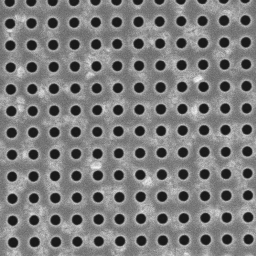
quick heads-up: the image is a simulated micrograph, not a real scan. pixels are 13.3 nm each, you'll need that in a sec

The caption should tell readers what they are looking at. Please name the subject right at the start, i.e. a regular array of holes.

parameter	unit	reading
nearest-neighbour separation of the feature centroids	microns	0.283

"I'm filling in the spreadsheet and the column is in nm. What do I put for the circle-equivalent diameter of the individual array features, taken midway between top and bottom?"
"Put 138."